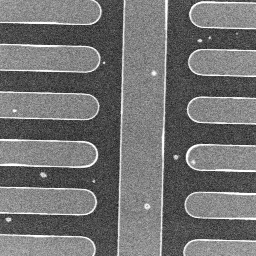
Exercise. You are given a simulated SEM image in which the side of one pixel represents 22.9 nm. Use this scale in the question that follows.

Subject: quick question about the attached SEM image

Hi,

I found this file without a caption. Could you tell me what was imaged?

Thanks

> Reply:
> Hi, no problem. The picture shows groups of lines, slits or small figures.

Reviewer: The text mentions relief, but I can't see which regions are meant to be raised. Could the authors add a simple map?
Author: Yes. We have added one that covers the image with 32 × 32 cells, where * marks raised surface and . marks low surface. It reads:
************....*****....*******
*************...*****...********
************...******...********
...............******.......****
...............******...........
...............******...........
************...******...********
************...******...********
************...******...********
...............******........***
...............******...........
...............******...........
************...******...********
************...*****...*********
************...*****....********
...............*****............
...............*****............
...............*****............
************...*****....********
************...*****...*********
************...*****....********
...............*****............
...............*****............
*****..........*****............
************...*****....********
************...*****...*********
***********....*****...*********
...............*****............
...............*****............
****...........*****............
************...*****...*********
************...*****...*********